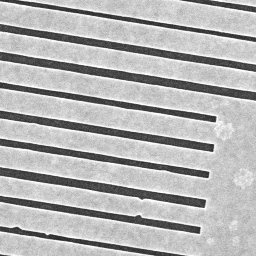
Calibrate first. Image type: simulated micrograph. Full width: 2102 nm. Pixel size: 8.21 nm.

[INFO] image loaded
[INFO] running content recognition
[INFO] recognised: parallel lines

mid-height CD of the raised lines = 173 nanometers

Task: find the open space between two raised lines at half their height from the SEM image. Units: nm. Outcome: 62.9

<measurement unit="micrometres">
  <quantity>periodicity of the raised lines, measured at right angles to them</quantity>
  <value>0.233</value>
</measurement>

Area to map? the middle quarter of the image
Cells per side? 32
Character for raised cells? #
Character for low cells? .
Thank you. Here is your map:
.......#########################
.............###################
#####...............############
###########...............######
#################...............
########################........
##############################..
...#############################
..........######################
#####...........################
###########...........##########
#################............###
########################........
##############################..
...#############################
.........#######################
#..............#################
########..............##########
###############..............###
####################............
##########################......
...#############################
..........######################
###............#################
#########.............##########
################............####
######################..........
############################....
..##############################
.........#######################
..............##################
######...............###########